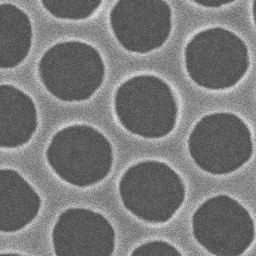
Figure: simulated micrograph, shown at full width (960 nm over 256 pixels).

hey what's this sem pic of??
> holes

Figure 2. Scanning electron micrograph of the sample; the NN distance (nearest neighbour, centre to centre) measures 309 nanometers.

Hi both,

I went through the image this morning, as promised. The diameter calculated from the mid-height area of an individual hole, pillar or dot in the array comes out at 238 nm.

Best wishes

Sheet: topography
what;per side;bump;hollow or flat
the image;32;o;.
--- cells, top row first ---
.oooo.......oo.......oooo...oooo
...ooo......oo.......ooooooooooo
....ooooo.oooo.......ooooooooooo
....oooooooooo.......oooooo.oooo
....oooooooooo.......ooo......oo
....ooo....oooo.....oooo.......o
....oo......ooooo..oooo........o
...oo........oooooooooo........o
.oooo........oooooooooo........o
ooooo........oooo..ooooo......oo
ooooo........oo......oooo....ooo
...ooo......oo........oooooooooo
....oooo...ooo........oooooooooo
....oooooooooo........oooooooooo
.....oooooooooo.......oooo....oo
.....oooooooooo.......ooo......o
....ooo.....oooo.....ooo.......o
....oo........oooooooooo.......o
oooooo........oooooooooo........
oooooo........oooooooooo.......o
oooooo........ooo....oooo......o
..ooooo.......oo......oooo...ooo
...ooooo.....oo........ooooooooo
....ooooooooooo........ooooooooo
.....oooooooooo........oooo.oooo
.....oooooooooo........oo.....oo
.....ooo....oooo......oo.......o
....ooo......oooo....ooo........
...oooo.......oooooooooo........
oooooo........oooooooooo........
ooooooo.......oooo...oooo......o
ooooooo.......ooo.....oooo....oo